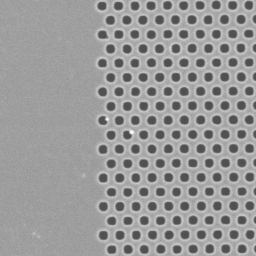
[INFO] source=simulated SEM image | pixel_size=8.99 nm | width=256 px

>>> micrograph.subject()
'a regular array of holes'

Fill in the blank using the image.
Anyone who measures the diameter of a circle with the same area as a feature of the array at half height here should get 84.2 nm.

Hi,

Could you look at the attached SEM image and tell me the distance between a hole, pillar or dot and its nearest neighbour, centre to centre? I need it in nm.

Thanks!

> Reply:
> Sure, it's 145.